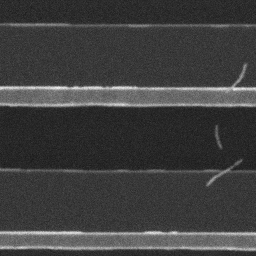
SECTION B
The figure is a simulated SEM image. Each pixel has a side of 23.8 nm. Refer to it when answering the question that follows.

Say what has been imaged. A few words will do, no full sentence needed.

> lines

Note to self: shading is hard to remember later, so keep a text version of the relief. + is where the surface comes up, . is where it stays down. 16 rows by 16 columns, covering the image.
................
................
++++++++++++++++
++++++++++++++++
++++++++++++++++
++++++++++++++++
++++++++++++++++
................
................
................
................
++++++++++++++++
++++++++++++++++
++++++++++++++++
++++++++++++++++
++.+++++++++++++